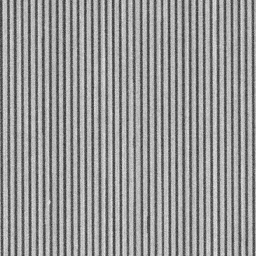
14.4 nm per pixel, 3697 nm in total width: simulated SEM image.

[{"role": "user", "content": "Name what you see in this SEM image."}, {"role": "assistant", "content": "parallel lines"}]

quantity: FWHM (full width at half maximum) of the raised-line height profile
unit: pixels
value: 3.62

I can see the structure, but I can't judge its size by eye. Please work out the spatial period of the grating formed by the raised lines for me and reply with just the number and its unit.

7.01 pixels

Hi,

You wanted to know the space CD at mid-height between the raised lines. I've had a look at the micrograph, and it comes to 52.3 nanometers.